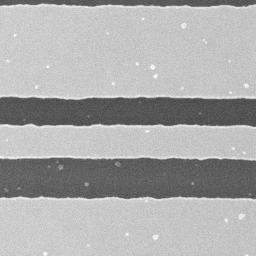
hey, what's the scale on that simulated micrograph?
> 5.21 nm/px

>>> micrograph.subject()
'lines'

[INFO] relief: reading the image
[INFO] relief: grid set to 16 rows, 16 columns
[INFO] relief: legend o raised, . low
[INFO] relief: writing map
oooooooooooooooo
oooooooooooooooo
oooooooooooooooo
oooooooooooooooo
oooooooooooooooo
oooooooooooooooo
................
................
oooooooooooooooo
oooooooooooooooo
................
................
oooooooooooooooo
oooooooooooooooo
oooooooooooooooo
oooooooooooooooo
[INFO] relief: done